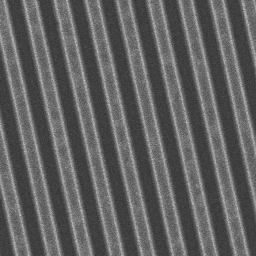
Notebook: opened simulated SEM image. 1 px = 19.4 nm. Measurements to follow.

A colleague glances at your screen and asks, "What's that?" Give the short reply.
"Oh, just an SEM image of parallel lines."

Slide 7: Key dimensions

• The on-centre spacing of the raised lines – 591 nm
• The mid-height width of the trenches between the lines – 0.298 microns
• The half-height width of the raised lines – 298 nanometers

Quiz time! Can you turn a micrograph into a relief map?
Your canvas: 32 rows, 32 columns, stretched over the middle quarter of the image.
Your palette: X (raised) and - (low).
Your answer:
-XXXX----XXX----XXXX----XXXX----
-XXXX----XXXX----XXXX----XXX----
-XXXX----XXXX----XXXX----XXX----
--XXX----XXXX----XXXX----XXXX---
--XXXX----XXX----XXXX----XXXX---
--XXXX----XXXX----XXX----XXXX---
--XXXX----XXXX----XXXX----XXX---
--XXXX----XXXX----XXXX----XXXX--
---XXXX----XXX----XXXX----XXXX--
---XXXX----XXX----XXXX----XXXX--
---XXXX----XXXX----XXXX---XXXX--
---XXXX----XXXX----XXXX----XXXX-
----XXX----XXXX----XXXX----XXXX-
----XXXX---XXXX----XXXX----XXXX-
----XXXX----XXXX----XXX----XXXX-
----XXXX----XXXX----XXXX----XXXX
----XXXX----XXXX----XXXX----XXXX
X----XXXX---XXXX----XXXX----XXXX
X----XXXX----XXX----XXXX----XXXX
X----XXXX----XXXX----XXXX----XXX
X----XXXX----XXXX----XXXX----XXX
X-----XXX----XXXX----XXXX----XXX
XX----XXXX---XXXX----XXXX----XXX
XX----XXXX----XXX-----XXX----XXX
XX----XXXX----XXXX----XXXX----XX
XX----XXXX----XXXX----XXXX----XX
XXX----XXX----XXXX----XXXX----XX
XXX----XXXX---XXXX----XXXX----XX
XXX----XXXX----XXXX----XXX-----X
XXX----XXXX----XXXX----XXXX----X
XXX----XXXX----XXXX----XXXX----X
XXXX----XXXX---XXXX----XXXX----X